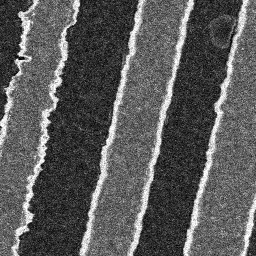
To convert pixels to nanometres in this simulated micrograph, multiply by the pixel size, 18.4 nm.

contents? one or a few lines or trenches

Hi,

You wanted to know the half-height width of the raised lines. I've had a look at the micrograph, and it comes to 876 nm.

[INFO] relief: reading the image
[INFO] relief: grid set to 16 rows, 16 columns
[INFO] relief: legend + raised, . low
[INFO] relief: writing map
..+++....+++...+
..++.....+++...+
.+++....+++....+
.+++....+++...++
.+++....+++...++
.++.....+++...++
.++....+++....++
+++....+++....++
+++....+++...+++
+++....+++...+++
++....+++....+++
++....+++....+++
++....+++...++++
++....+++...++++
+....++++...++++
+....+++....+++.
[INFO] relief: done